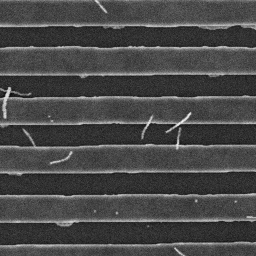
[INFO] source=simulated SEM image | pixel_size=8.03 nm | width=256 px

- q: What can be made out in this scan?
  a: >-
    lines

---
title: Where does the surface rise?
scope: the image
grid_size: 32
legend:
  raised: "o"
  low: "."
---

oooooooooooooooooooooooooooooooo
oooooooooooooooooooooooooooooooo
oooooooooooooooooooooooooooooooo
................................
................................
................................
oooooooooooooooooooooooooooooooo
oooooooooooooooooooooooooooooooo
oooooooooooooooooooooooooooooooo
................................
................................
................................
oooooooooooooooooooooooooooooooo
oooooooooooooooooooooooooooooooo
oooooooooooooooooooooooooooooooo
ooooooooooo.......o..oo.........
................................
................................
oooooooooooooooooooooooooooooooo
oooooooooooooooooooooooooooooooo
oooooooooooooooooooooooooooooooo
oooooooooooooo..oo..............
................................
................................
oooooooo.ooooooooooooooooooooooo
oooooooooooooooooooooooooooooooo
oooooooooooooooooooooooooooooooo
oooooooooooooooooooooooooooooooo
................................
................................
.....................ooooooooooo
oooooooooooooooooooooooooooooooo